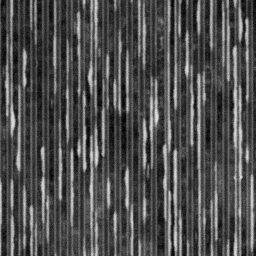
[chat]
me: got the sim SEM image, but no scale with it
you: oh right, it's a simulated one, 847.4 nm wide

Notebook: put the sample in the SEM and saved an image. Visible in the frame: parallel lines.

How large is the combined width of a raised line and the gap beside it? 0.0397 um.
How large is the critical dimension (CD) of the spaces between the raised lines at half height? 19 nm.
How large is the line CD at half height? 0.0219 micrometres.